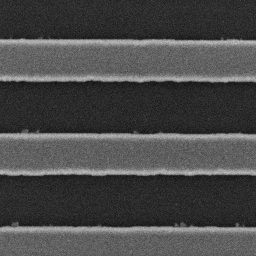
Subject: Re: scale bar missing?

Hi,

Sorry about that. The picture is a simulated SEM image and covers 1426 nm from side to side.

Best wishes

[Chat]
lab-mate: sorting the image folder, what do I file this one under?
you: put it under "lines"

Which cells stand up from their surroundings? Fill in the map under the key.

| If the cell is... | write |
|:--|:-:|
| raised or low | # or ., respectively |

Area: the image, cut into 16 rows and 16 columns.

................
................
#######..#......
################
################
................
................
................
################
################
################
................
................
................
################
################